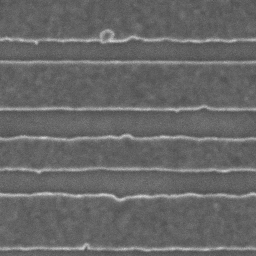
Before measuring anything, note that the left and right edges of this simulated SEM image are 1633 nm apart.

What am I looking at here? one or a few lines or trenches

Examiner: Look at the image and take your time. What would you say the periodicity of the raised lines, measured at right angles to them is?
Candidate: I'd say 68.2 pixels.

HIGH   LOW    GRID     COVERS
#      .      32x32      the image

################################
################################
################################
################################
################################
................................
................................
................................
################################
################################
################################
################################
################################
#########################.######
................................
................................
................................
################################
################################
################################
################################
................................
................................
................................
##############......#.#######..#
################################
################################
################################
################################
################################
################################
................................